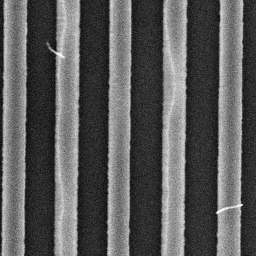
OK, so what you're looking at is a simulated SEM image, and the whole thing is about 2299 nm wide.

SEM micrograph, lines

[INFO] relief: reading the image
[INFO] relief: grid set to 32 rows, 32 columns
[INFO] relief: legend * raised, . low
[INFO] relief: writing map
.**.....**....**.....**.....**..
.**.....**....**.....**....***..
.**.....**....**.....**.....**..
.**.....**....**.....**.....**..
.**....***....**.....**....***..
.**....***....**.....**....***..
.**....***....**.....**....***..
.**....***....**.....**....***..
.**....***....**.....**....***..
.**....***....**.....**....***..
.**....***....**.....**....***..
.**....***....**.....**....***..
.**....***....**.....**....***..
***....***....**.....**....***..
***....***....**.....**....***..
***....***....**.....**....***..
***....***....**.....**....***..
***....***....**.....**....***..
***....***....**.....**....***..
***....***....**.....**....***..
***....***....**.....**....***..
***....***....**.....**....***..
***....***....**.....**....***..
***....***....**.....**....***..
***....***....**.....**....***..
***....***....**.....**....***..
***....***....**.....**....***..
***....***....**.....**....***..
***....***....**.....**....***..
***....***....**....***....***..
***....***....**....***....***..
***....***....**....***....***..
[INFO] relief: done